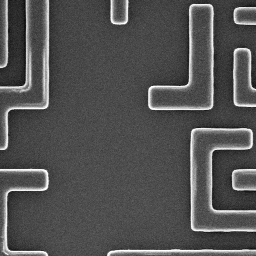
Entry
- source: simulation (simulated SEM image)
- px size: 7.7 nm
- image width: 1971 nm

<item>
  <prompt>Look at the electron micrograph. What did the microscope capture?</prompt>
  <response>wiring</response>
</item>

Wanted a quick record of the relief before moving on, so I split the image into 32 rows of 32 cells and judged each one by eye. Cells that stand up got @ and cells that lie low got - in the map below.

@--@@@--------@@----------------
@--@@@--------@@--------@@@--@@@
@--@@@--------@@--------@@@--@@@
@--@@@------------------@@@-----
@--@@@------------------@@@-----
@--@@@------------------@@@-----
@--@@@------------------@@@--@@-
@--@@@------------------@@@--@@-
---@@@------------------@@@--@@-
---@@@------------------@@@--@@-
---@@@-----------------@@@@--@@-
@@@@@@-------------@@@@@@@@--@@@
@@@@@@-------------@@@@@@@@--@@@
@@@@@@-------------@@@@@@@------
@-------------------------------
@-------------------------------
@-----------------------@@@@@@@-
@-----------------------@@@@@@@-
@-----------------------@@@@@@@-
------------------------@@@-----
------------------------@@------
@@@@@@------------------@@---@@@
@@@@@@------------------@@---@@@
@@@@@@------------------@@---@@@
@-----------------------@@------
@-----------------------@@@-----
@-----------------------@@@@@@@@
@-----------------------@@@@@@@@
@-----------------------@@@@@@@@
@-------------------------------
@-------------------------------
@@@@@@--------@@@@@@@@@@@@@@@@@@